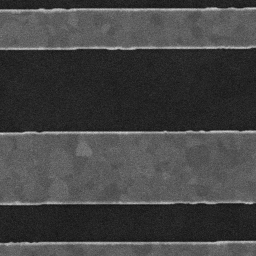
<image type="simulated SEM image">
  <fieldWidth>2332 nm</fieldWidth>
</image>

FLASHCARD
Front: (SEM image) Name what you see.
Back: lines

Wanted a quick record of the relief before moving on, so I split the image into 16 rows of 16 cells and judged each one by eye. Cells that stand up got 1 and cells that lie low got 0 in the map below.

0000000000000000
1111111111111111
1111111111111111
0000000000000000
0000000000000000
0000000000000000
0000000000000000
0000000000000000
1111111111111111
1111111111111111
1111111111111111
1111111111111111
1111111111111111
0000000000000000
0000000000000000
1111111111111111